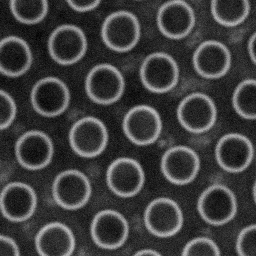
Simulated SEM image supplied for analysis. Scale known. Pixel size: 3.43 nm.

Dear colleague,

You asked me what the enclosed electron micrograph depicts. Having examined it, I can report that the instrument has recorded a regular array of raised bodies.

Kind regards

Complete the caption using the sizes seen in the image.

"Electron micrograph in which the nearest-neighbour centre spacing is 187 nm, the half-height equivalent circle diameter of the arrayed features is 0.125 um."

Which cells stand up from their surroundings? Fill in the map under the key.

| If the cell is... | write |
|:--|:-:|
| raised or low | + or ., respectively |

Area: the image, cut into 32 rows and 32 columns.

.+++++...+++.........++....++++.
..++++..............++++...++++.
...++........++++...++++...+++..
........+....++++...++++........
.......+++...++++....++.........
+++...+++++..++++........++....+
++++..++++...............+++...+
++++...+++........+++...+++++...
+++.........++....++++...+++....
...........++++...++++....+.....
.....+++...++++...++++........++
....++++...++++..............+++
+...++++....++.........+++...+++
++..++++.........++...+++++...++
++..............++++..+++++...++
+.........+++...++++...++++.....
.........++++...++++............
...+++...++++....++.........+++.
..++++...++++.........+....++++.
..++++...............+++...++++.
...+++........+++...+++++...+++.
........++....++++...+++........
.......++++...++++...+++........
.+++...++++...+++.........++....
++++...++++..............++++...
++++....++.........+++...++++...
++++.........+....++++...++++...
..+.........++++..+++++...+++...
......++....++++...+++.........+
.....++++...++++..............++
++...++++...+++.........+++...++
++...++++.........+....++++...++